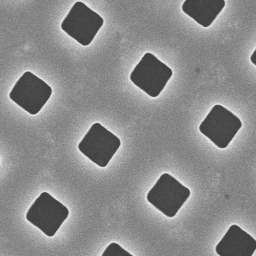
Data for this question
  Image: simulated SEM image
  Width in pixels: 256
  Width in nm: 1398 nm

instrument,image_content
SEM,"holes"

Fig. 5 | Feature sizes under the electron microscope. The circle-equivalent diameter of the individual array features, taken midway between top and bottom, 209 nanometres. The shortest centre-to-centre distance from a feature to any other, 469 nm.